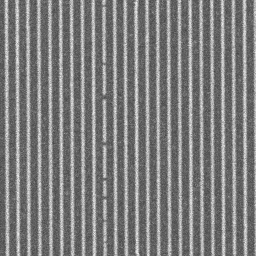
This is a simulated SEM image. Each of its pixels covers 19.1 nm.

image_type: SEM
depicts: parallel lines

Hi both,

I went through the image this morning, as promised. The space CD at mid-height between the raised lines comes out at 167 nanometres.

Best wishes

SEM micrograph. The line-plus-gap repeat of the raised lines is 207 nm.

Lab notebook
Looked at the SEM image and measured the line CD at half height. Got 50.1 nm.